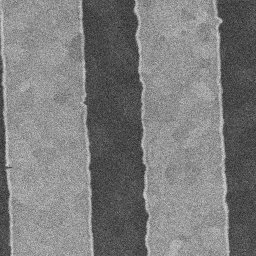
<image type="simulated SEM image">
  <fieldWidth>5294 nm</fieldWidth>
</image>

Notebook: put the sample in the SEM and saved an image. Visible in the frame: one or a few lines or trenches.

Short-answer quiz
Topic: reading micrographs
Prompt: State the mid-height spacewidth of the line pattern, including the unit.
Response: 1180 nm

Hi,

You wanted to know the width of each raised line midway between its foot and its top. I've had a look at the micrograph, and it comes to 1620 nm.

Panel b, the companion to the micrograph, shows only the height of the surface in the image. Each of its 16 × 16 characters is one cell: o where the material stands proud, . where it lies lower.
ooooo....oooo...
ooooo....ooooo..
ooooo....ooooo..
ooooo....ooooo..
ooooo....ooooo..
ooooo....ooooo..
ooooo....ooooo..
ooooo....ooooo..
ooooo....ooooo..
oooooo...ooooo..
.ooooo...ooooo..
.ooooo...ooooo..
.ooooo...ooooo..
.ooooo...ooooo..
.ooooo...ooooo..
.ooooo...ooooo..